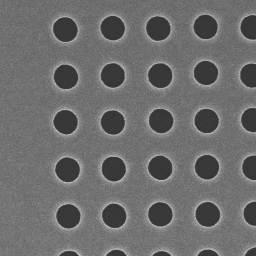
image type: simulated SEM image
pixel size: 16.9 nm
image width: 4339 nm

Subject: a regular array of holes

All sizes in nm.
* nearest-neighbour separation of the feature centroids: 781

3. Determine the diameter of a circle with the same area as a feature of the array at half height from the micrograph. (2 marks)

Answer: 419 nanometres